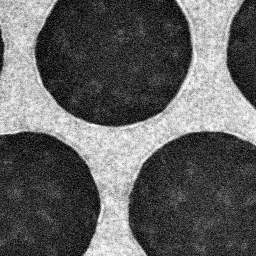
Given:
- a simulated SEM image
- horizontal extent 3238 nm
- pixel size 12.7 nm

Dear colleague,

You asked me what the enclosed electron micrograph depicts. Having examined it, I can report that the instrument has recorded holes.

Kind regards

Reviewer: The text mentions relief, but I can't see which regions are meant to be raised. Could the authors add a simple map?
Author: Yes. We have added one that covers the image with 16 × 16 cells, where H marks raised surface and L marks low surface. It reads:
HHHLLLLLLLLHHHHL
HHHLLLLLLLLLHHLL
HHLLLLLLLLLLHHLL
HHLLLLLLLLLLHHLL
HHLLLLLLLLLLHHLL
HHHLLLLLLLLHHHHL
HHHHLLLLLLLHHHHH
HHHHHLLLLHHHHHHH
LLLHHHHHHHHLLLLH
LLLLLHHHHHLLLLLL
LLLLLLHHHLLLLLLL
LLLLLLHHLLLLLLLL
LLLLLLHHLLLLLLLL
LLLLLLHHLLLLLLLL
LLLLLLHHLLLLLLLL
LLLLLLHHHLLLLLLL